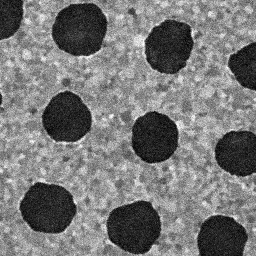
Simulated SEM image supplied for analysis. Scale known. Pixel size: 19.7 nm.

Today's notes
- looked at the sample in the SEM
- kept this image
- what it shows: holes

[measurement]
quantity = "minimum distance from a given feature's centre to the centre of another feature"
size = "1770 nanometres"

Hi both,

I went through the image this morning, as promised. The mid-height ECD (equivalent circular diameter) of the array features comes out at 1.05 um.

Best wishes